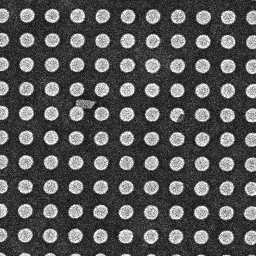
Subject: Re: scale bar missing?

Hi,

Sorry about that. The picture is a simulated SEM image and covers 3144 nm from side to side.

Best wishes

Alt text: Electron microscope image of a regular array of raised bodies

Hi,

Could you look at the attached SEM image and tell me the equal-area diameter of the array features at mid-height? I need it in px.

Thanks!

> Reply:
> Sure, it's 13.8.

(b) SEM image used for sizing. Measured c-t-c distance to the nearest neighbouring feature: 299 nanometers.